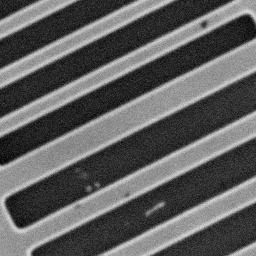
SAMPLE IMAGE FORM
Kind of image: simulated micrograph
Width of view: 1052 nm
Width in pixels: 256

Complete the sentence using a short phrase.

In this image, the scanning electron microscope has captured groups of lines, slits or small figures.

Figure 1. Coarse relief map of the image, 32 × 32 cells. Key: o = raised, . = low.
....oooo.........ooo.........ooo
..oooo.........ooo.........ooooo
oooo.........oooo........oooo...
ooo........oooo........oooo.....
.........oooo........oooo.......
.......oooo........oooo........o
.....oooo........oooo........ooo
...oooo........oooo........ooooo
.oooo........oooo........ooooooo
ooo........oooo........ooooooo..
o........oooo........ooooooo....
.......oooo........ooooooo......
.....oooo........ooooooo........
...oooo........oooooooo.........
.oooo........oooooooo..........o
ooo........oooooooo..........ooo
o........oooooooo..........ooooo
.......oooooooo..........oooooo.
.....oooooooo..........oooooo...
...oooooooo..........oooooo.....
.oooooooo..........oooooo.......
ooooooo..........oooooo.........
ooooo..........oooooo...........
ooo..........oooooo...........oo
o..........oooooo...........oooo
.........oooooo...........ooooo.
o......oooooo..........oooooo...
o....oooooo...........ooooo.....
oo.oooooo...........ooooo.......
ooooooo...........ooooo.........
ooooo...........ooooo...........
oooo..........ooooo...........oo